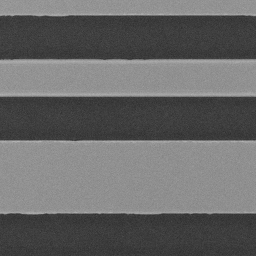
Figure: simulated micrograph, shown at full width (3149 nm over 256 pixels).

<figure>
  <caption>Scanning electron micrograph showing lines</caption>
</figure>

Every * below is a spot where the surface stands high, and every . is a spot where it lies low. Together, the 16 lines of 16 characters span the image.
****************
................
................
................
****************
****************
................
................
................
****************
****************
****************
****************
................
................
................